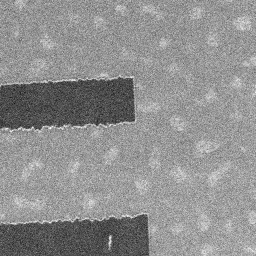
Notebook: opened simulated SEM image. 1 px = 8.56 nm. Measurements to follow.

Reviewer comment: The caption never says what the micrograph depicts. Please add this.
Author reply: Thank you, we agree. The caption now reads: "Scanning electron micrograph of one or a few lines or trenches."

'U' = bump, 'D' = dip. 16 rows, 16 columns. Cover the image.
DDDDDDDDDDDDDDDD
DDDDDDDDDDDDDDDD
DDDDDDDDDDDDDDDD
DDDDDDDDDDDDDDDD
DDDDDDDDDDDDDDDD
UUUUUUUUDDDDDDDD
UUUUUUUUDDDDDDDD
UUUUUUUUDDDDDDDD
DDDDDDDDDDDDDDDD
DDDDDDDDDDDDDDDD
DDDDDDDDDDDDDDDD
DDDDDDDDDDDDDDDD
DDDDDDDDDDDDDDDD
DDDDDDDDUDDDDDDD
UUUUUUUUUDDDDDDD
UUUUUUUUUDDDDDDD